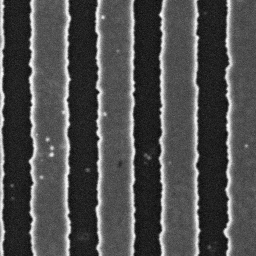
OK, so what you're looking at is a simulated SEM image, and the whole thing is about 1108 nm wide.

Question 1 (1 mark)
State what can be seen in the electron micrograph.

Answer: lines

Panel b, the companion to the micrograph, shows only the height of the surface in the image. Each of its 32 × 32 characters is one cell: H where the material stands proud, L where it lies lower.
LLLLHHHHHLLLHHHHHLLLHHHHHLLLHHHH
LLLLHHHHHLLLHHHHHLLLHHHHHLLLHHHH
LLLLHHHHHLLLHHHHHLLLHHHHHLLLHHHH
LLLLHHHHHLLLHHHHHLLLHHHHHLLLHHHH
LLLLHHHHLLLLHHHHHLLLHHHHHLLLHHHH
LLLLHHHHHLLLHHHHHLLLHHHHHLLLHHHH
LLLLHHHHLLLLHHHHHLLLHHHHHLLLHHHH
LLLLHHHHHLLLHHHHHLLLHHHHHLLLLHHH
LLLLHHHHLLLLHHHHHLLLHHHHHLLLHHHH
LLLLHHHHHLLLHHHHHLLLHHHHHLLLHHHH
LLLLHHHHHLLLHHHHHLLLHHHHHLLLHHHH
LLLLHHHHHLLLHHHHHLLLHHHHHLLLHHHH
LLLLHHHHLLLLHHHHHLLLHHHHHLLLHHHH
LLLLHHHHHLLLHHHHHLLLHHHHHLLLLHHH
LLLLHHHHHLLLHHHHHLLLHHHHHLLLHHHH
LLLLHHHHHLLLHHHHHLLLHHHHHLLLHHHH
LLLLHHHHLLLLHHHHHLLLHHHHHLLLHHHH
LLLLHHHHHLLLHHHHHLLLHHHHHLLLHHHH
LLLLHHHHHLLLHHHHHLLLHHHHHLLLHHHH
LLLLHHHHHLLLHHHHHLLLHHHHHLLLHHHH
LLLLHHHHHLLLHHHHHLLLHHHHHLLLHHHH
LLLLHHHHHLLLHHHHHLLLHHHHHLLLHHHH
LLLLHHHHLLLLHHHHHLLLHHHHHLLLHHHH
LLLLHHHHHLLLHHHHHLLLHHHHHLLLHHHH
LLLLHHHHLLLLHHHHHLLLHHHHHLLLHHHH
LLLLHHHHLLLLHHHHHLLLHHHHHLLLHHHH
LLLLHHHHHLLLHHHHHLLLHHHHHLLLHHHH
LLLLHHHHHLLLHHHHHLLLHHHHHLLLLHHH
LLLLHHHHHLLLHHHHHLLLHHHHHLLLHHHH
LLLLHHHHHLLLHHHHHLLLHHHHHLLLHHHH
LLLLHHHHHLLLHHHHHLLLHHHHHLLLHHHH
LLLLHHHHHLLLHHHHHLLLHHHHHLLLHHHH